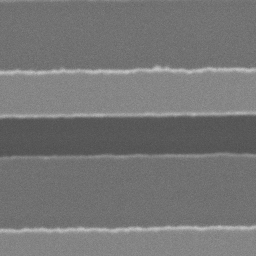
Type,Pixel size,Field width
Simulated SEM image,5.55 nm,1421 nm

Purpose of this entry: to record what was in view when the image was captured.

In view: lines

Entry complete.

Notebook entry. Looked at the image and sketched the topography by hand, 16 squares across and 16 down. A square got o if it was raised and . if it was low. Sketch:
oooooooooooooooo
oooooooooooooooo
oooooooooooooooo
oooooooooooooooo
oooooooooooooooo
oooooooooooooooo
oooooooooooooooo
................
................
................
oooooooooooooooo
oooooooooooooooo
oooooooooooooooo
oooooooooooooooo
oooooooooooooooo
oooooooooooooooo